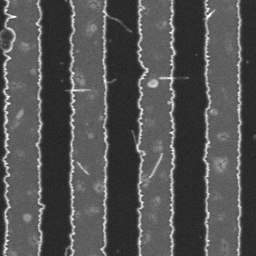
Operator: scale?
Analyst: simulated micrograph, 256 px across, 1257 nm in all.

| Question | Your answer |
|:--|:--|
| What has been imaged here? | one or a few lines or trenches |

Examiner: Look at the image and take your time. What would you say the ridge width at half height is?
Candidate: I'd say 173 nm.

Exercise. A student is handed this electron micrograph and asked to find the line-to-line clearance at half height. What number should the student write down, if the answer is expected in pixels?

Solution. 31.1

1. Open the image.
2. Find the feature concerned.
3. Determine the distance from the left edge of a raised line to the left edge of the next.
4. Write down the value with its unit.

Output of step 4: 330 nm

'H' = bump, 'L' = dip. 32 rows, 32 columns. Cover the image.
HLLLLHHHHLLLLHHHHLLLLLHHHHLLLLHH
HLLLLHHHHLLLLHHHHLLLLLHHHHLLLLHH
HLLLLHHHHLLLLHHHHHLLLHHHHHLLLLHH
HLLLLHHHHLLLLHHHHHLLLLHHHHLLLLHH
HHLLLHHHHLLLLHHHHHLLLLHHHHLLLLHH
HHLLLHHHHLLLLHHHHLLLLHHHHHLLLLHH
HLLLLHHHHLLLLHHHHHLLLLHHHHLLLLHH
HLLLLHHHHLLLLHHHHHLLLLHHHHLLLLHH
HLLLLHHHHLLLLHHHHHLLLLHHHHLLLLHH
HLLLLHHHHLLLLHHHHHLLLHHHHHLLLLHH
HLLLLHHHHLLLLHHHHLLHLHHHHHLLLLHH
HLLLLHHHHLLLLHHHHHLLLLHHHHLLLLHH
HLLLLHHHHLLLLHHHHHLLLLHHHHLLLLHH
HLLLLHHHHLLLLHHHHHLLLLHHHHLLLLHH
HLLLLHHHHLLLLHHHHHLLLHHHHHLLLLHH
HLLLLHHHHLLLLHHHHHLLLLHHHHLLLLHH
HLLLLHHHHLLLLHHHHHLLLLHHHHLLLLHH
HLLLLHHHHLLLLHHHHHLLLLHHHHLLLLHH
HLLLLHHHHLLLLHHHHLLLLHHHHHLLLLHH
HLLLLHHHHLLLLHHHHHLLLLHHHHLLLLHH
HLLLLHHHHLLLLHHHHHLLLLHHHHLLLLHH
HLLLLHHHHLLLLHHHHHLLLHHHHHLLLLHH
HLLLLHHHHLLLLHHHHHLLLHHHHHLLLLHH
HLLLLHHHHLLLLHHHHLLLLHHHHHLLLLHH
HLLLLHHHHLLLLHHHHHLLLLHHHHLLLLHH
HLLLLHHHHLLLLHHHHHLLLLHHHHLLLLHH
HLLLLHHHHLLLLHHHHLLLLLHHHHLLLLHH
HLLLLHHHHLLLLHHHHHLLLHHHHHLLLLHH
HLLLLHHHHLLLLHHHHHLLLLHHHHLLLLHH
HLLLLHHHHLLLLHHHHHLLLHHHHHLLLLHH
HLLLLHHHHLLLLHHHHHLLLLHHHHLLLLHH
HLLLLHHHHLLLLHHHHHLLLLHHHHLLLLHH